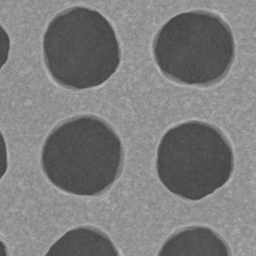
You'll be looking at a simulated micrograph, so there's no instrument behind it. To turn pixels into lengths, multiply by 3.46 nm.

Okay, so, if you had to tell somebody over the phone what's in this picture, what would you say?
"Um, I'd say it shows holes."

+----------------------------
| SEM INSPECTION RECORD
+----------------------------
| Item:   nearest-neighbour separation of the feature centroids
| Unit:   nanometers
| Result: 380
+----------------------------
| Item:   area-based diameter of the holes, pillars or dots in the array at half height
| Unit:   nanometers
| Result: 273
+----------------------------